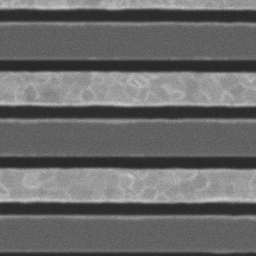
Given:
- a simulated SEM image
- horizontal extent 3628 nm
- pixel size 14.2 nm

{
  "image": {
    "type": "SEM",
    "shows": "lines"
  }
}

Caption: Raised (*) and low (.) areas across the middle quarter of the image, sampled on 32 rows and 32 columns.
................................
................................
********************************
********************************
********************************
********************************
********************************
********************************
********************************
********************************
*.***........************.......
................................
................................
................................
********************************
********************************
********************************
********************************
********************************
********************************
********************************
********************************
********************************
................................
................................
................................
********************************
********************************
********************************
********************************
********************************
********************************